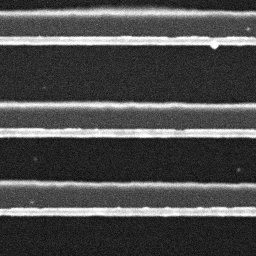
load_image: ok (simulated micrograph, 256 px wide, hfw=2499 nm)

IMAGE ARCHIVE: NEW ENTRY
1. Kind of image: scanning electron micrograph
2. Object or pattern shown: lines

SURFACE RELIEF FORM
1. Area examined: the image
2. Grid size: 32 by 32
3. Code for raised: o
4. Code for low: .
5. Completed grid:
................................
................................
oooooooooooooooooooooooooooooooo
oooooooooooooooooooooooooooooooo
oooooooooooooooooooooooooooooooo
.oo.o.....oo....oo.ooooooooooooo
................................
................................
................................
................................
................................
................................
................................
oooooooooooooooooooooooooooooooo
oooooooooooooooooooooooooooooooo
oooooooooooooooooooooooooooooooo
oooooooooooooooooooooooooooooooo
................................
................................
................................
................................
................................
................................
oooooooooooooooooooooooooooooooo
oooooooooooooooooooooooooooooooo
oooooooooooooooooooooooooooooooo
oooooooooooooooooooooooooooooooo
................................
................................
................................
................................
................................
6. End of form